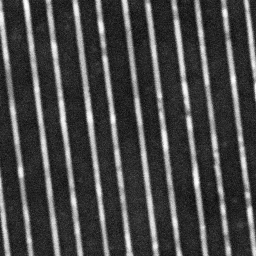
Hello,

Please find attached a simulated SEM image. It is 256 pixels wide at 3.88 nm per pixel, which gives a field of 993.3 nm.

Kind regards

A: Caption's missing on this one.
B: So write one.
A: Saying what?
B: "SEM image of parallel lines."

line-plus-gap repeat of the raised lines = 95.2 nm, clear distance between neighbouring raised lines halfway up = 87 nm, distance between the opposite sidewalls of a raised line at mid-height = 13.4 nm